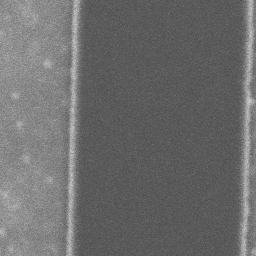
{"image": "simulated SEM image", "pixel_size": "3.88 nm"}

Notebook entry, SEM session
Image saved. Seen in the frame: one or a few lines or trenches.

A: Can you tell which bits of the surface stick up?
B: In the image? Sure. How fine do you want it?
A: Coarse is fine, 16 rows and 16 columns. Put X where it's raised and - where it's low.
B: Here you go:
-----XXXXXXXXXXX
-----XXXXXXXXXXX
-----XXXXXXXXXXX
-----XXXXXXXXXXX
-----XXXXXXXXXXX
-----XXXXXXXXXXX
-----XXXXXXXXXXX
----XXXXXXXXXXXX
----XXXXXXXXXXXX
----XXXXXXXXXXX-
----XXXXXXXXXXX-
----XXXXXXXXXXX-
----XXXXXXXXXXX-
----XXXXXXXXXXX-
----XXXXXXXXXXX-
----XXXXXXXXXXX-